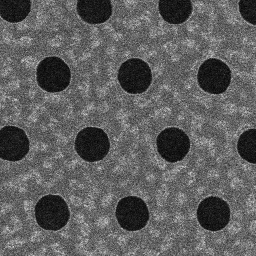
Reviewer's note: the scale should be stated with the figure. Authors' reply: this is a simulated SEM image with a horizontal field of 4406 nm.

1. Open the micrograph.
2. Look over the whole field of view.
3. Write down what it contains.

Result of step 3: a regular array of holes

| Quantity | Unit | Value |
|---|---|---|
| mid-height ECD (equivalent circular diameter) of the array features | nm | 613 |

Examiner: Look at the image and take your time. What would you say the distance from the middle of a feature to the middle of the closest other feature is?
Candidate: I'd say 1370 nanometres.